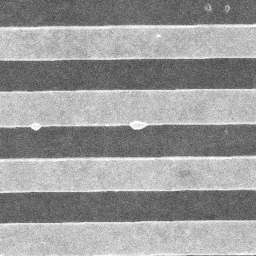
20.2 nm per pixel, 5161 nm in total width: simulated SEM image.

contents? lines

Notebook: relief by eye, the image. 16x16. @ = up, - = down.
----------------
----------------
@@@@@@@@@@@@@@@@
@@@@@@@@@@@@@@@@
----------------
----------------
@@@@@@@@@@@@@@@@
@@@@@@@@@@@@@@@@
----------------
----------------
@@@@@@@@@@@@@@@@
@@@@@@@@@@@@@@@@
----------------
----------------
@@@@@@@@@@@@@@@@
@@@@@@@@@@@@@@@@